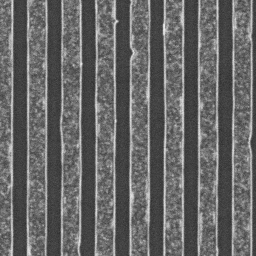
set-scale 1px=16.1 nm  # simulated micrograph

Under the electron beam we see parallel lines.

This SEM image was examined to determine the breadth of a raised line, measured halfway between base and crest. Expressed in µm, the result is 0.296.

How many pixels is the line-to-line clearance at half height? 15.7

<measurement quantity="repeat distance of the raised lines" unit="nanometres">551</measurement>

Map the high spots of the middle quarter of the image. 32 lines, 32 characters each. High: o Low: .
oooo....ooooo....oooo....ooooo..
oooo....ooooo....oooo....ooooo..
oooo....ooooo....oooo....ooooo..
oooo....ooooo....oooo....ooooo..
oooo....ooooo....oooo....ooooo..
oooo....ooooo....oooo....ooooo..
oooo....ooooo....o..o....ooooo..
oooo....ooooo....oo.o....ooooo..
oooo....ooooo....oooo....ooooo..
oooo....ooooo....oooo....ooooo..
oooo....ooooo....oooo.....oooo..
oooo....ooooo....oooo.....oooo..
oooo....ooooo....oooo.....oooo..
oooo....ooooo....oooo.....oooo..
oooo....ooooo....oooo.....oooo..
oooo....ooooo....oooo.....oooo..
oooo....ooooo....oooo.....oooo..
oooo....ooooo....oooo.....oooo..
oooo....ooooo....oooo.....oooo..
oooo....ooooo....oooo....ooooo..
oooo....ooooo....oooo....ooo.o..
oooo....ooooo....oooo....ooooo..
oooo....ooooo....oooo....ooooo..
oooo....ooooo....oooo....ooooo..
oooo....ooooo....oooo....ooooo..
oooo....ooooo....oooo....ooooo..
oooo....ooooo....oooo....ooooo..
oooo....ooooo....oooo....ooooo..
oooo....ooooo....oooo....ooooo..
oooo....ooooo....oooo....ooooo..
oooo....ooooo....oooo....ooooo..
oooo....ooooo....oooo....ooooo..